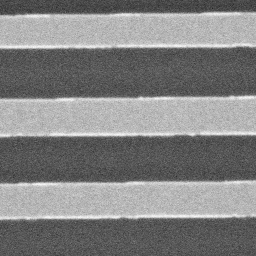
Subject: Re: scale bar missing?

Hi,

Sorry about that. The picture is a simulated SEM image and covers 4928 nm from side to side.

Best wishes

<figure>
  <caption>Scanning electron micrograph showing lines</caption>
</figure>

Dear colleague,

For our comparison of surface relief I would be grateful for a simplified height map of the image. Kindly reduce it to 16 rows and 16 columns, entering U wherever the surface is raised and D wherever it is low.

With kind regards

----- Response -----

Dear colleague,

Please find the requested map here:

DDDDDDDDDDDDDDDD
UUUUUUUUUUUUUUUU
UUUUUUUUUUUUUUUU
DDDDDDDDDDDDDDDD
DDDDDDDDDDDDDDDD
DDDDDDDDDDDDDDDD
UUUUUUUUUUUUUUUU
UUUUUUUUUUUUUUUU
DDDDDDDDDDDDDDDD
DDDDDDDDDDDDDDDD
DDDDDDDDDDDDDDDD
DUUUUUUUUUUUUUUU
UUUUUUUUUUUUUUUU
UUUUUUUUUUUUUUDD
DDDDDDDDDDDDDDDD
DDDDDDDDDDDDDDDD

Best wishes